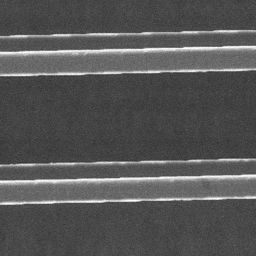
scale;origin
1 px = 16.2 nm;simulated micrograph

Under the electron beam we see lines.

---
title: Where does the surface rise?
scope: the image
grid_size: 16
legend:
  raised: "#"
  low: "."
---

................
................
################
################
##########......
................
................
................
................
................
################
################
#########.......
................
................
................